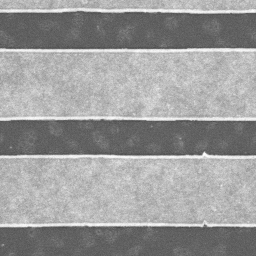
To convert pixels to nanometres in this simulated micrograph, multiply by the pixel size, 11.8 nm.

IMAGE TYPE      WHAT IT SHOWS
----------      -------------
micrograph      one or a few lines or trenches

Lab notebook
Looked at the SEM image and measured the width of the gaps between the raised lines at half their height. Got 38.9 pixels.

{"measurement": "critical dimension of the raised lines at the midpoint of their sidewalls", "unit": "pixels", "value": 67.6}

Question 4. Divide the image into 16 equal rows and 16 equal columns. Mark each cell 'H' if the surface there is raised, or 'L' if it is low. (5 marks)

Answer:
HHHHHHHHHHHHHHHH
LLLLLLLLLLLLLLLL
LLLLLLLLLLLLLLLL
HHHHHHHHHHHHHHHH
HHHHHHHHHHHHHHHH
HHHHHHHHHHHHHHHH
HHHHHHHHHHHHHHHH
LLLLLLLLLLLLLLLL
LLLLLLLLLLLLLLLL
LLLLLLLLLLLLLLLL
HHHHHHHHHHHHHHHH
HHHHHHHHHHHHHHHH
HHHHHHHHHHHHHHHH
HHHHHHHHHHHHHHHH
LLLLLLLLLLLLLLLL
LLLLLLLLLLLLLLLL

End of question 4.